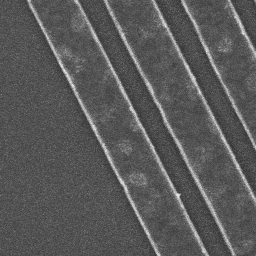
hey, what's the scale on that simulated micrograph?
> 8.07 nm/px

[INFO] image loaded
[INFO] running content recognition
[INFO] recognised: one or a few lines or trenches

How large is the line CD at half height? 350 nm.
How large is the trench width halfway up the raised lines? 196 nanometres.